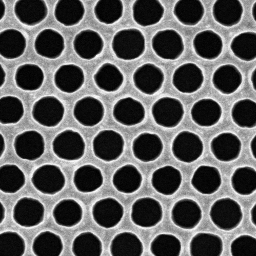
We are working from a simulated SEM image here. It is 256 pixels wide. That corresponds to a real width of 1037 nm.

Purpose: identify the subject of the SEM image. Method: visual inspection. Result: a regular array of holes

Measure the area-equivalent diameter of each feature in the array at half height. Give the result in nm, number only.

118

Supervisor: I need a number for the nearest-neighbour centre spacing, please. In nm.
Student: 156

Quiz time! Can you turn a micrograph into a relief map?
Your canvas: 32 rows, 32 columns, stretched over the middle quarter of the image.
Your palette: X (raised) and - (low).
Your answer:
---XXXXXXX---XXXXXXX---XXXXXX---
----XXXXX-----XXXX------XXXX----
-----XXX------XXXX-------XX-----
-----XXX-------XX--------XX-----
-----XXX-------XXX-------XX-----
----XXXX------XXXX------XXXX----
---XXXXXXX---XXXXXX----XXXXXX---
XXXXXXXXXXXXXXXXXXXXX-XXXXXXXXXX
XXXXX---XXXXXXXX-XXXXXXXX--XXXXX
XXX------XXXX------XXXX------XXX
XXX-------XXX-------XX--------XX
XXX-------XX--------XX--------XX
XXX-------XX--------XX--------XX
XXX-------XXX-------XX-------XXX
XXXX-----XXXXX-----XXXX------XXX
XXXXXX-XXXXXXXXXXXXXXXXXX---XXXX
XXXXXXXXXX--XXXXXXXXXXXXXXXXXXXX
----XXXXX-----XXXXXX--XXXXXXX---
-----XXX-------XXX------XXXX----
-----XX--------XX-------XXX-----
-----XX--------XX--------XX-----
-----XX--------XX-------XXX-----
-----XXX------XXXX------XXXX----
----XXXXX----XXXXX-----XXXXX----
XXXXXXXXXXXXXXXXXXXXXXXXXXXXXX--
XXXXX--XXXXXXXX--XXXXXXXXX-XXXXX
XXX------XXXX-----XXXXX-----XXXX
XXX------XXXX------XXX-------XXX
XXX-------XX-------XXX-------XXX
XXX-------XX-------XXX-------XXX
XXX------XXXX------XXX-------XXX
XXXX----XXXXX-----XXXXX-----XXXX